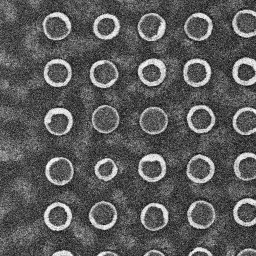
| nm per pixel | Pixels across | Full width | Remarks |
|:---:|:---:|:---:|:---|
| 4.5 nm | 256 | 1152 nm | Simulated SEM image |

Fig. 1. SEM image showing a regular array of raised bodies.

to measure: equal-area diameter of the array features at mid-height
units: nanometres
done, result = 122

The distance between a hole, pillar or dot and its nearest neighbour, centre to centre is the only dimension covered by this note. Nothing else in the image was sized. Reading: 205 nanometers